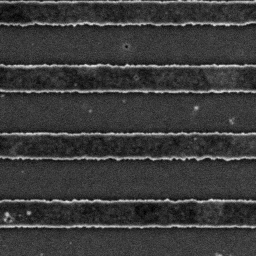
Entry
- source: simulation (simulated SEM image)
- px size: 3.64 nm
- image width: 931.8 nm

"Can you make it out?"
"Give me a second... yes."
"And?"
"lines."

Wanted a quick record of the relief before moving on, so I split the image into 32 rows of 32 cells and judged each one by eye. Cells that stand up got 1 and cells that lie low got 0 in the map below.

11111111111111111111111111111111
11111111111111111111111111111111
11111111111111111111111111111111
00000000000000000000000000000000
00000000000000000000000000000000
00000000000000000000000000000000
00000000000000000000000000000000
00000000000000000000000000000000
11111111111111111111111111111111
11111111111111111111111111111111
11111111111111111111111111111111
00011001001000010011111111111101
00000000000000000000000000000000
00000000000000000000000000000000
00000000000000000000000000000000
00000000000000000000000000000000
00000000000000000000000000000000
11111111111111111111111111111111
11111111111111111111111111111111
11111111111111111111111111111111
00000000000000000000000000000000
00000000000000000000000000000000
00000000000000000000000000000000
00000000000000000000000000000000
00000000000000000000000000000000
11111111111111111111111111111111
11111111111111111111111111111111
11111111111111111111111111111111
00000000000000000000000000000000
00000000000000000000000000000000
00000000000000000000000000000000
00000000000000000000000000000000